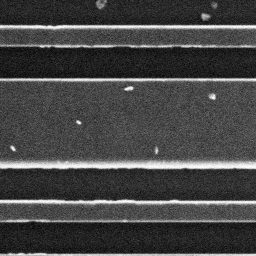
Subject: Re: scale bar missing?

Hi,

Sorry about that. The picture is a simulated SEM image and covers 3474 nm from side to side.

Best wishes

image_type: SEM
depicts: lines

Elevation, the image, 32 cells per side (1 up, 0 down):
00000000000000000000000000000000
00000000000000000000000000000000
00000000000000000000000000000000
11111111111111111111111111111111
11111111111111111111111111111111
11111111111111111111111111111111
00000000000000000000000000000000
00000000000000000000000000000000
00000000000000000000000000000000
00000000000000000000000000000000
11111111111111111111111111111111
11111111111111111111111111111111
11111111111111111111111111111111
11111111111111111111111111111111
11111111111111111111111111111111
11111111111111111111111111111111
11111111111111111111111111111111
11111111111111111111111111111111
11111111111111111111111111111111
11111111111111111111111111111111
11111111111111111111111111111111
00000000000000000000000000000000
00000000000000000000000000000000
00000000000000000000000000000000
00000000000000000000000000000000
11111111111111111111111111111111
11111111111111111111111111111111
11111111111111111111111111111111
00000000000000000000000000000000
00000000000000000000000000000000
00000000000000000000000000000000
00000000000000000000000000000000